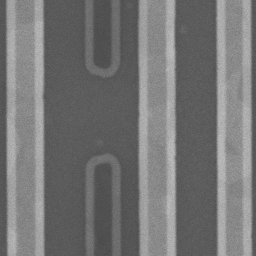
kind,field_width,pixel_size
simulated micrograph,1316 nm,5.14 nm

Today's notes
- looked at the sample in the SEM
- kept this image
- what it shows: one or a few lines or trenches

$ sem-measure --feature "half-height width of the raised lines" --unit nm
145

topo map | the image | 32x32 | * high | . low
.****......***....***.......***.
.****......***....***.......***.
.****......***....***.......***.
.****......***....***.......***.
.****......***....***.......***.
.****......***....***.......***.
.****......***....***.......***.
.****......***....***.......***.
.****......***....***.......***.
.****.............***.......***.
.****.............***.......***.
.****.............***.......***.
.****.............***.......***.
.****.............***.......***.
.****.............***.......***.
.****.............***.......***.
.****.............***.......***.
.****.............***.......***.
.****.............***.......***.
.****.............***.......***.
.****......***....***.......***.
.****......****...***.......***.
.****......****...***.......***.
.****......****...***.......***.
.****......****...***.......***.
.****......****...***.......***.
..***......****...***.......***.
..***......****...***.......***.
..***......****...***.......***.
.****......****...***.......***.
..***......****...***.......***.
..***......****...***.......***.